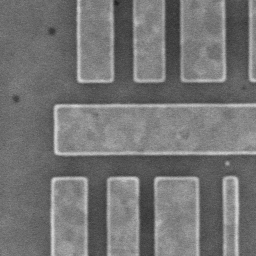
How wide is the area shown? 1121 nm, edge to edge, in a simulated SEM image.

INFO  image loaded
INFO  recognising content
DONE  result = groups of lines, slits or small figures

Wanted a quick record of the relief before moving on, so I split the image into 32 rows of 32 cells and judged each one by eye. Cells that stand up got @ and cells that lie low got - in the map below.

----------@@@@---@@@---@@@@@---@
----------@@@@---@@@---@@@@@---@
----------@@@@---@@@---@@@@@---@
----------@@@@---@@@---@@@@@---@
----------@@@@---@@@---@@@@@---@
----------@@@@---@@@---@@@@@---@
----------@@@@---@@@---@@@@@---@
----------@@@@---@@@---@@@@@---@
----------@@@@---@@@---@@@@@---@
----------@@@@---@@@---@@@@@---@
--------------------------------
--------------------------------
--------------------------------
-------@@@@@@@@@@@@@@@@@@@@@@@@@
-------@@@@@@@@@@@@@@@@@@@@@@@@@
-------@@@@@@@@@@@@@@@@@@@@@@@@@
-------@@@@@@@@@@@@@@@@@@@@@@@@@
-------@@@@@@@@@@@@@@@@@@@@@@@@@
-------@@@@@@@@@@@@@@@@@@@@@@@@@
--------------------------------
--------------------------------
--------------------------------
-------@@@@---@@@---@@@@----@---
-------@@@@---@@@--@@@@@@---@---
-------@@@@---@@@--@@@@@@---@---
-------@@@@---@@@--@@@@@@---@---
-------@@@@---@@@---@@@@@---@---
-------@@@@---@@@---@@@@@---@---
-------@@@@---@@@---@@@@@---@---
-------@@@@---@@@---@@@@@---@---
-------@@@@---@@@---@@@@@---@---
-------@@@@---@@@---@@@@@---@@--